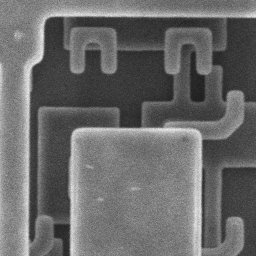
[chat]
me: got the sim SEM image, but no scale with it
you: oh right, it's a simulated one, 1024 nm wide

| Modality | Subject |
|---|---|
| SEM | wiring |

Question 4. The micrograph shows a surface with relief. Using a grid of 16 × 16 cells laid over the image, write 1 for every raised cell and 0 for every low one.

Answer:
1111111111111111
1110000000000000
1110000000000000
1110000000000000
1100000000000000
1100000000000000
1100000000000000
1100000000000000
1100011111110000
1100111111111000
1100111111111000
1100111111111000
1100111111111000
1100111111111000
1100111111111000
1100111111111000